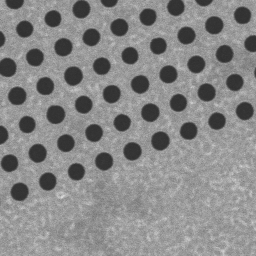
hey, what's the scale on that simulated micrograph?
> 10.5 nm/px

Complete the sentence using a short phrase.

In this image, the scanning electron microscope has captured a regular array of holes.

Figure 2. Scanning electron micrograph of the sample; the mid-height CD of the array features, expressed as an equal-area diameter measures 189 nm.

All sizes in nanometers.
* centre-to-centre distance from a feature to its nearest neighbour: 312